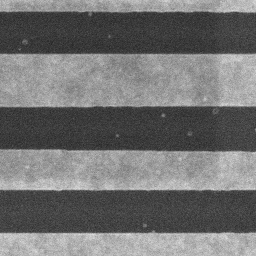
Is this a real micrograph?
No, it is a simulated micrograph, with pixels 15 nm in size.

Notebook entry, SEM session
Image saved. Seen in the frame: lines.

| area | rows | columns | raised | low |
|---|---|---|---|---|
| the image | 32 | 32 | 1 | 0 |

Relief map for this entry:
11111111111111111111111111111111
00000000000000000000000000000000
00000000000000000000000000000000
00000000000000000000000000000000
00000000000000000000000000000000
00000000000000000000000000000000
00000000000000000000000000000000
11111111111111111111111111111111
11111111111111111111111111111111
11111111111111111111111111111111
11111111111111111111111111111111
11111111111111111111111111111111
11111111111111111111111111111111
00000000000000000000000000000000
00000000000000000000000000000000
00000000000000000000000000000000
00000000000000000000000000000000
00000000000000000000000000000000
00000000000000000000000000000000
11111111111111111111111111111111
11111111111111111111111111111111
11111111111111111111111111111111
11111111111111111111111111111111
11111111111111111111111111111111
00000000000000000000000000000000
00000000000000000000000000000000
00000000000000000000000000000000
00000000000000000000000000000000
00000000000000000000000000000000
11111111111111111111111111111111
11111111111111111111111111111111
11111111111111111111111111111111